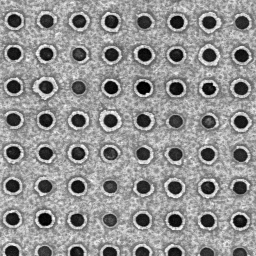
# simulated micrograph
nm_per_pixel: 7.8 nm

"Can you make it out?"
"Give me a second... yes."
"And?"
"a regular array of holes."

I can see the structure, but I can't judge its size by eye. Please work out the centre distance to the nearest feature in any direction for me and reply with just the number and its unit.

252 nm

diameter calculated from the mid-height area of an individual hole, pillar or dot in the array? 111 nanometres